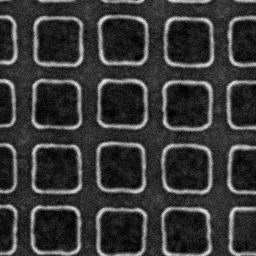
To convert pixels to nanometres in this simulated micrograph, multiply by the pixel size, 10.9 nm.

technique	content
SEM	a regular array of raised bodies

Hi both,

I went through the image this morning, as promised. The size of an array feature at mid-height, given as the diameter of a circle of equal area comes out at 566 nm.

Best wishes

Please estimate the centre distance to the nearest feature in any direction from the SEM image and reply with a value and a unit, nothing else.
689 nanometres